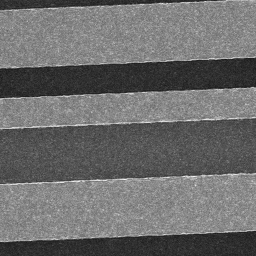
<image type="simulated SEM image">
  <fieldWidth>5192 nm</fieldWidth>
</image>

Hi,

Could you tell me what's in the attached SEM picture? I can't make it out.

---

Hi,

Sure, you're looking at lines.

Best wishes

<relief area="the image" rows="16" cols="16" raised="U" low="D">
DDDDUUUUUUUUUUUU
UUUUUUUUUUUUUUUU
UUUUUUUUUUUUUUUU
UUUUUUUUUUUUUUUU
DDDDDDDDDDDDDDDD
DDDDDDDDDDDDDDDU
UUUUUUUUUUUUUUUU
UUUUUUUUUUUUDDDD
DDDDDDDDDDDDDDDD
DDDDDDDDDDDDDDDD
DDDDDDDDDDDDDDDD
DUUUUUUUUUUUUUUU
UUUUUUUUUUUUUUUU
UUUUUUUUUUUUUUUU
UUUUUUUUUUUUUUUD
DDDDDDDDDDDDDDDD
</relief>